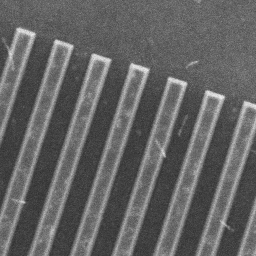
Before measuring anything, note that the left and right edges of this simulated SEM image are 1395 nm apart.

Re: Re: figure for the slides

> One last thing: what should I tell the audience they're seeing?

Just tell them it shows parallel lines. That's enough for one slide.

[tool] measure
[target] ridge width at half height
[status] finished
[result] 90.8 nanometers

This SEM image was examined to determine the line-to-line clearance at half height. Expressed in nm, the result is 126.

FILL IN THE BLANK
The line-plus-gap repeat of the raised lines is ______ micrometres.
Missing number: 0.215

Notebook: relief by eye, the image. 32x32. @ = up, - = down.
--------------------------------
--------------------------------
--------------------------------
--------------------------------
--@@----------------------------
--@@---@------------------------
-@@@---@@-----------------------
-@@---@@@--@@-------------------
-@@---@@---@@---@@--------------
@@@---@@---@@---@@--------------
@@---@@@--@@@---@@---@@---------
@@---@@---@@---@@@---@@---------
@@---@@---@@---@@---@@@---@@----
@---@@@---@@---@@---@@---@@---@@
@---@@---@@---@@@---@@---@@---@@
@---@@---@@---@@---@@@---@@---@@
---@@@---@@---@@---@@---@@----@@
---@@---@@@--@@@---@@---@@---@@-
---@@---@@---@@---@@@---@@---@@-
--@@@---@@---@@---@@---@@@---@@-
--@@---@@@---@@---@@---@@---@@--
--@@---@@---@@---@@@---@@---@@--
-@@@---@@---@@---@@---@@@---@@--
-@@---@@@---@@---@@---@@---@@---
-@@---@@---@@@--@@@---@@---@@---
@@@---@@---@@---@@---@@@---@@---
@@---@@@---@@---@@---@@---@@@---
@@---@@---@@@---@@---@@---@@---@
@@---@@---@@---@@---@@@---@@---@
@----@@---@@---@@---@@---@@@---@
@---@@---@@@---@@---@@---@@---@@
@---@@---@@---@@---@@@---@@---@@